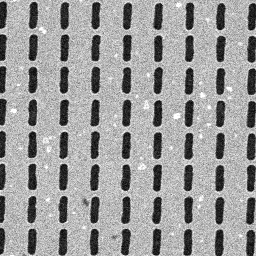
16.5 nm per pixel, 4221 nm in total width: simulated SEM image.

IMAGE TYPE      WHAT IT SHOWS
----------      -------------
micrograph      a regular array of holes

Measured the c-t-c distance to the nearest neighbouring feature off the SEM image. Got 514 nm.